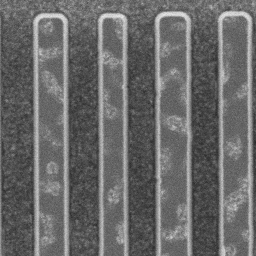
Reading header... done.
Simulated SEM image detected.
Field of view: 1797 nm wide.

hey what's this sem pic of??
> one or a few lines or trenches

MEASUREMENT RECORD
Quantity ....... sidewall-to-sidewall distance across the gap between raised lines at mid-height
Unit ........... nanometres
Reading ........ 218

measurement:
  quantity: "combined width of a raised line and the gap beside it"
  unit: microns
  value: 0.431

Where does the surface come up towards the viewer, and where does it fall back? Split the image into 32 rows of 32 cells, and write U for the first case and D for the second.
DDDDDDDDDDDDDDDDDDDDDDDDDDDDDDDD
DDDDDDDDDDDDDDDDDDDDDDDDDDDDDDDD
DDDDDUUUDDDDDUUUDDDDUUUUDDDDUUUD
DDDDUUUUDDDDUUUUDDDDUUUUDDDUUUUD
DDDDUUUUDDDDUUUUDDDDUUUUDDDUUUUD
DDDDUUUUDDDDUUUUDDDDUUUUDDDDUUUD
DDDDUUUUDDDDDUUUDDDDUUUUDDDDUUUD
DDDDUUUUDDDDDUUUDDDDUUUUDDDDUUUD
DDDDUUUUDDDDDUUUDDDDUUUUDDDDUUUD
DDDDUUUUDDDDDUUUDDDDUUUUDDDUUUUD
DDDDUUUUDDDDDUUUDDDDUUUUDDDDUUUD
DDDDUUUUDDDDDUUUDDDDUUUUDDDUUUUD
DDDDUUUUDDDDDUUUDDDDUUUUDDDDUUUD
DDDDDUUUDDDDDUUUDDDDUUUUDDDUUUUD
DDDDUUUUDDDDDUUUDDDDUUUUDDDUUUUD
DDDDUUUUDDDDDUUUDDDDUUUUDDDDUUUD
DDDDUUUUDDDDDUUUDDDDUUUUDDDDUUUD
DDDDUUUUDDDDDUUUDDDDUUUUDDDDUUUD
DDDDUUUUDDDDDUUUDDDDUUUUDDDDUUUD
DDDDUUUUDDDDDUUUDDDDUUUUDDDDUUUD
DDDDUUUUDDDDDUUUDDDDUUUUDDDDUUUD
DDDDUUUUDDDDDUUUDDDDUUUUDDDDUUUD
DDDDUUUUDDDDDUUUDDDDUUUUDDDDUUUD
DDDDUUUUDDDDDUUUDDDDUUUUDDDDUUUD
DDDDUUUUDDDDDUUUDDDDUUUUDDDDUUUD
DDDDUUUUDDDDDUUUDDDDUUUUDDDDUUUD
DDDDDUUUDDDDDUUUDDDDUUUUDDDDUUUD
DDDDDUUUDDDDDUUUDDDDUUUUDDDDUUUD
DDDDDUUUDDDDDUUUDDDDUUUUDDDDUUUD
DDDDDUUUDDDDDUUUDDDDUUUUDDDDUUUD
DDDDDUUUDDDDDUUUDDDDUUUUDDDDUUUD
DDDDDUUUDDDDDUUUDDDDUUUUDDDDUUUD